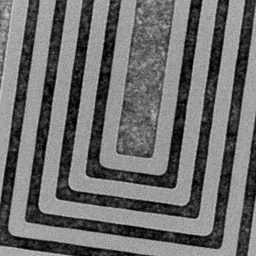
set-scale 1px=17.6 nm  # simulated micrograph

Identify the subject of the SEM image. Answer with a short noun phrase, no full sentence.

groups of lines, slits or small figures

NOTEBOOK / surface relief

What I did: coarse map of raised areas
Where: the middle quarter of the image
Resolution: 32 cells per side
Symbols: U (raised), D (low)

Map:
UUDDDUUUUDDDUUUUDDDDDDDDDDUUUDDD
UUDDDUUUUDDDUUUUDDDDDDDDDUUUUDDD
UUDDDUUUUDDDUUUDDDDDDDDDDUUUUDDD
UUDDDUUUUDDDUUUDDDDDDDDDDUUUUDDD
UUDDDUUUDDDDUUUDDDDDDDDDDUUUUDDD
UDDDDUUUDDDUUUUDDDDDDDDDDUUUUDDD
UDDDDUUUDDDUUUUDDDDDDDDDDUUUDDDU
UDDDUUUUDDDUUUUDDDDDDDDDDUUUDDDU
UDDDUUUUDDDUUUUDDDDDDDDDDUUUDDDU
UDDDUUUUDDDUUUUDDDDDDDDDUUUUDDDU
UDDDUUUUDDDUUUDDDDDDDDDDUUUUDDDU
UDDDUUUUDDDUUUDDDDDDDDDDUUUUDDDU
UDDDUUUDDDUUUUDDDDDDDDDDUUUUDDDU
DDDUUUUDDDUUUUDDDDDDDDDDUUUUDDDU
DDDUUUUDDDUUUUDDDDDDDDDDUUUDDDUU
DDDUUUUDDDUUUUDDDDDDDDDUUUUDDDUU
DDDUUUUDDDUUUUDDDDDDDDDUUUUDDDUU
DDDUUUUDDDUUUDDDDDDDDDDUUUUDDDUU
DDDUUUDDDDUUUDDDDDDDDDDUUUUDDDUU
DDDUUUDDDUUUUDDDDDDDDDDUUUUDDDUU
DDDUUUDDDUUUUDDDDDDDDDDUUUDDDDUU
DDUUUUDDDUUUUDDDDDDDDDDUUUDDDUUU
DDUUUUDDDUUUUDDDDDDDDDUUUUDDDUUU
DDUUUUDDDUUUUUUUUUUUDDUUUUDDDUUU
DDUUUUDDDUUUUUUUUUUUUUUUUUDDDUUU
DDUUUDDDDDUUUUUUUUUUUUUUUUDDDUUU
DDUUUDDDDDDDDDDUUUUUUUUUUDDDDUUU
DDUUUDDDDDDDDDDDDDDDDUUUUDDDDUUU
DUUUUUUDDDDDDDDDDDDDDDDDDDDDUUUU
DUUUUUUUUUUUUUUDDDDDDDDDDDDDUUUU
DUUUUUUUUUUUUUUUUUUUUDDDDDDDUUUU
DDDUUUUUUUUUUUUUUUUUUUUUUUUUUUUU